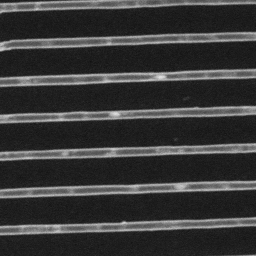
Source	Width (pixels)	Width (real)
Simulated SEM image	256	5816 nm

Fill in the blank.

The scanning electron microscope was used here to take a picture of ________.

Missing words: parallel lines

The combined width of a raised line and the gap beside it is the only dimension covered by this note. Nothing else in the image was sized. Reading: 37.2 pixels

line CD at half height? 184 nm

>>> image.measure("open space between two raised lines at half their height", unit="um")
0.658